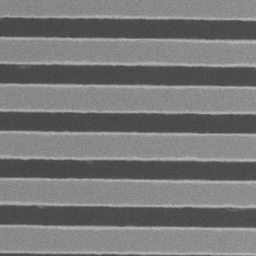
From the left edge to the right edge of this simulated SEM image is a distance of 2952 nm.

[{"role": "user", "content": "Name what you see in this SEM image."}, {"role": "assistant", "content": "lines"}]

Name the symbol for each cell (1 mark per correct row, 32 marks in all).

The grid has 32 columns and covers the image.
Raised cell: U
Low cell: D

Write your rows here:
UUUUUUUUUUUUUUUUUUUUUUUUUUUUUUUU
UUUUUUUUUUUUUUUUUUUUUUUUUUUUUUUU
DDDDDDDDDDDDDDDDDDDDDDDDDDDDDDUU
DDDDDDDDDDDDDDDDDDDDDDDDDDDDDDDD
DDDDDDDDDDDDDDDDDDDDDDDDDDDDDDDD
UUUUUUUUUUUUUUUUUUUUUUUUUUUUUUUU
UUUUUUUUUUUUUUUUUUUUUUUUUUUUUUUU
UUUUUUUUUUUUUUUUUUUUUUUUUUUUUUUU
DDDDDDDDDDDDDDDDDDDDDDDDDDDDDDDD
DDDDDDDDDDDDDDDDDDDDDDDDDDDDDDDD
DUDDDDDDDDDDDDDDDDDDDDDDDDDDDDDD
UUUUUUUUUUUUUUUUUUUUUUUUUUUUUUUU
UUUUUUUUUUUUUUUUUUUUUUUUUUUUUUUU
UUUUUUUUUUUUUUUUUUUUUUUUUUUUUUUU
DDDDDDDDDDDDDDDDDDDDDDDDDDDDDDDD
DDDDDDDDDDDDDDDDDDDDDDDDDDDDDDDD
UUUUUDDDDDDDDDDDDDDDDDDDDDDDDDDD
UUUUUUUUUUUUUUUUUUUUUUUUUUUUUUUU
UUUUUUUUUUUUUUUUUUUUUUUUUUUUUUUU
UUUUUUUUUUUUUUUUUUUUUUUUUUUUUUUU
DDDDDDDDDDDDDDDDDDDDDDDDDDDDDDDD
DDDDDDDDDDDDDDDDDDDDDDDDDDDDDDDD
UUUUUUUUUUUUUUUUUDDDDDDDDDDDDDDD
UUUUUUUUUUUUUUUUUUUUUUUUUUUUUUUU
UUUUUUUUUUUUUUUUUUUUUUUUUUUUUUUU
UUUUUUUUUUUUUUUUUUUUUUUUUUUUUUUU
DDDDDDDDDDDDDDDDDDDDDDDDDDDDDDDD
DDDDDDDDDDDDDDDDDDDDDDDDDDDDDDDD
UUUUUUUUUUUUUUUUUUUUUUUUUUUUUUUU
UUUUUUUUUUUUUUUUUUUUUUUUUUUUUUUU
UUUUUUUUUUUUUUUUUUUUUUUUUUUUUUUU
UUUUUUUUUUUUUUUUUUUUUUUUUUUUUUUU